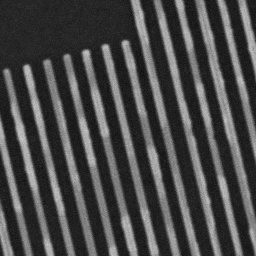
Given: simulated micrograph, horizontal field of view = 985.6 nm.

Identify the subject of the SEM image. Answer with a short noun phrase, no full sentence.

parallel lines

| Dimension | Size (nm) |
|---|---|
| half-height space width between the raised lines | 55.3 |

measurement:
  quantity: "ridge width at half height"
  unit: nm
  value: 24.4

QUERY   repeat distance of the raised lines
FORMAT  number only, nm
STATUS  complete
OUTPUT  79